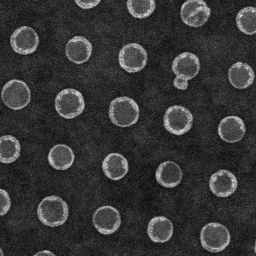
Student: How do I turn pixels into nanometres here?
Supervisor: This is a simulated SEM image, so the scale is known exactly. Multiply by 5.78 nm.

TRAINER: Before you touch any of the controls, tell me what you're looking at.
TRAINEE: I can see a regular array of raised bodies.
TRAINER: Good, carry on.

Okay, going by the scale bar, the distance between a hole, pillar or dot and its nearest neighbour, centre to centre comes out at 0.314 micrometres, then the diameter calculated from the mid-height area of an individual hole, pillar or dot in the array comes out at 154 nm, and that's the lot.